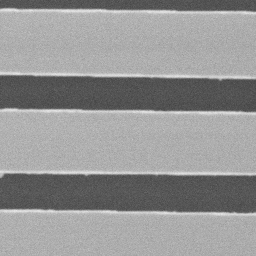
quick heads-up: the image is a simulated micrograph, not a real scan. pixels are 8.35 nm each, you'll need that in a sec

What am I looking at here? lines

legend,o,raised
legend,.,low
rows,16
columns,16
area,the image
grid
................
oooooooooooooooo
oooooooooooooooo
oooooooooooooooo
oooooooooooooooo
................
................
oooooooooooooooo
oooooooooooooooo
oooooooooooooooo
oooooooooooooooo
................
................
oooooooooooooooo
oooooooooooooooo
oooooooooooooooo